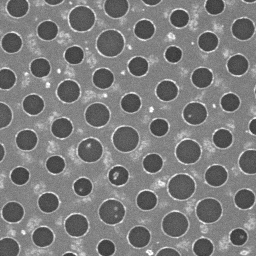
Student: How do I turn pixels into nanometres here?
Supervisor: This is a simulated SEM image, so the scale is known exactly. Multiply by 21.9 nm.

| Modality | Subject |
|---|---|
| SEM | a regular array of holes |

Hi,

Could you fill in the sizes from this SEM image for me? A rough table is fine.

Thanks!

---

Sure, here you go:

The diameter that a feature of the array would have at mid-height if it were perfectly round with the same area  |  459 nm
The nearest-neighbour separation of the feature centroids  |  793 nm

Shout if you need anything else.